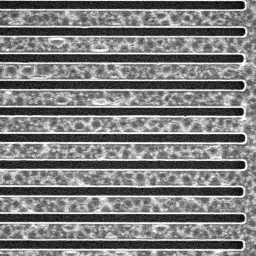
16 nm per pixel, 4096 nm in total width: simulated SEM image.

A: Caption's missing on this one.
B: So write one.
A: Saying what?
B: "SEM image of parallel lines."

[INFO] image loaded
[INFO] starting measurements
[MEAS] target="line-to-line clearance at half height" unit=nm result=152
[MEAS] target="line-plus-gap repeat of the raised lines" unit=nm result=426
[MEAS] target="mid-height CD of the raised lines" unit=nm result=274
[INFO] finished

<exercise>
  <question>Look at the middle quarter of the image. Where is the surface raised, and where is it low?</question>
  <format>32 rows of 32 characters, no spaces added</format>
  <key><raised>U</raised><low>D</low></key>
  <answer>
UUUUUUUUUUUUUUUUUUUUUUUUUUUUUUUU
UUUUUUUUUUUUUUUUUUUUUUUUUUUUUUUU
UUUUUUUUUUUUUUUUUUUUUUUUUUUUUUUU
UUUUUUUUUUUUUUUUUUUUUUUUUUUUUUUU
DDDDDDDDDDDDDDDDDDDDDDDDDDDDDDDD
DDDDDDDDDDDDDDDDDDDDDDDDDDDDDDDD
UUUUUUUUUUUDDDDDDDDDDDDDDDDDDDDD
UUUUUUUUUUUUUUUUUUUUUUUUUUUUUUUU
UUUUUUUUUUUUUUUUUUUUUUUUUUUUUUUU
UUUUUUUUUUUUUUUUUUUUUUUUUUUUUUUU
UUUUUUUUUUUUUUUUUUUUUUUUUUUUUUUU
DDDDDDDDDDDDDDDDDDDDDDDDDDDDDDDD
DDDDDDDDDDDDDDDDDDDDDDDDDDDDDDDD
UUUUUUUUUUUUUUUUUUUUUUUUUUUUUUUU
UUUUUUUUUUUUUUUUUUUUUUUUUUUUUUUU
UUUUUUUUUUUUUUUUUUUUUUUUUUUUUUUU
UUUUUUUUUUUUUUUUUUUUUUUUUUUUUUUU
DDDDDDDDDDDDDDDDDDDDDDDDDDDDDDDD
DDDDDDDDDDDDDDDDDDDDDDDDDDDDDDDD
DDDDDDDDDDDDDDDDDDDDDDDDDDDDDDDD
UUUUUUUUUUUUUUUUUUUUUUUUUUUUUUUU
UUUUUUUUUUUUUUUUUUUUUUUUUUUUUUUU
UUUUUUUUUUUUUUUUUUUUUUUUUUUUUUUU
UUUUUUUUUUUUUUUUUUUUUUUUUUUUUUUU
DDDDDDDDDDDDDDDDDDDDDDDDDDDDDDDD
DDDDDDDDDDDDDDDDDDDDDDDDDDDDDDDD
UUUUUUUUUUUUUUUUUUUUDDDDDDDDDDDD
UUUUUUUUUUUUUUUUUUUUUUUUUUUUUUUU
UUUUUUUUUUUUUUUUUUUUUUUUUUUUUUUU
UUUUUUUUUUUUUUUUUUUUUUUUUUUUUUUU
UUUUUUUUUUUUUUUUUUUUUUUUUUUUUUUU
DDDDDDDDDDDDDDDDDDDDDDDDDDDDDDDD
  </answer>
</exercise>